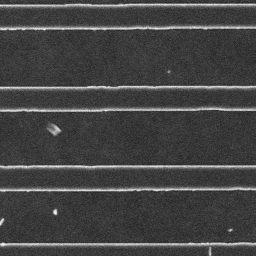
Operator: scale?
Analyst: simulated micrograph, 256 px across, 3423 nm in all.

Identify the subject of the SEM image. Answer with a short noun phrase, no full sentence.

lines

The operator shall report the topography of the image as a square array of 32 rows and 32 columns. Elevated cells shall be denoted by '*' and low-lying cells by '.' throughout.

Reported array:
................................
********************************
********************************
**********************.*.*......
................................
................................
................................
................................
................................
................................
................................
********************************
********************************
********************************
................................
................................
................................
................................
................................
................................
................................
********************************
********************************
********************************
................................
................................
................................
................................
................................
................................
*.......................********
********************************